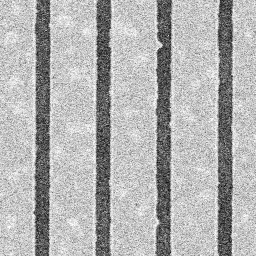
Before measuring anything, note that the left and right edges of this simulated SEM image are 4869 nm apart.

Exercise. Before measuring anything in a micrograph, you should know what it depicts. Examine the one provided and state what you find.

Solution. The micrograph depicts parallel lines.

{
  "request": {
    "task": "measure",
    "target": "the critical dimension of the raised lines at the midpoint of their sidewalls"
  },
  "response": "830 nm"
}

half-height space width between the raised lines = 321 nm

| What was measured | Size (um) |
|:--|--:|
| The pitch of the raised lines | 1.16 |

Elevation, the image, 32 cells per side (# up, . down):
####..######..#####...#####..###
####..######..#####...#####..###
####..######..#####...#####..###
####..######..#####...#####..###
####..######..#####...#####..###
####..######..######..#####..###
####..######..######..#####..###
####..######..#####...#####..###
####..######..#####...#####..###
####..######..#####...#####..###
####..######..#####...#####..###
####..######..#####...#####..###
####..######..#####...#####..###
####..######..#####...#####..###
####..######..#####...#####..###
####..######..#####...#####..###
####..######..#####...#####..###
####..######..######..#####..###
####..######..#####...#####..###
####..######..#####...#####..###
####..######..#####...#####..###
####..######..#####...#####..###
####..######..#####...#####..###
####..######..#####..######..###
####..######..#####..######..###
####..######..#####..######..###
####..######..#####...#####..###
####..######..######..#####..###
####..######..#####..######..###
####..######..#####...#####..###
####..######..#####...#####..###
####..######..#####...#####..###